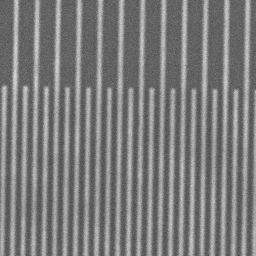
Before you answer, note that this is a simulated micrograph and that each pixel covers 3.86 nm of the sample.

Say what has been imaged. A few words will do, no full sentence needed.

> parallel lines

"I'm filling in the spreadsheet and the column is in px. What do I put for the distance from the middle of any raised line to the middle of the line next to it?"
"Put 10.5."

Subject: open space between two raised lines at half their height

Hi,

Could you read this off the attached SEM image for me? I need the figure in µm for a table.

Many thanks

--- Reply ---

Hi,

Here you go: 0.0299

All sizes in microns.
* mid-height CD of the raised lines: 0.013